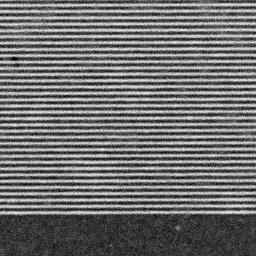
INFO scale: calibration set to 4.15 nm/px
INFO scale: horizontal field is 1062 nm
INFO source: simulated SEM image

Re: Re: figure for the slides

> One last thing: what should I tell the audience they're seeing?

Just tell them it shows parallel lines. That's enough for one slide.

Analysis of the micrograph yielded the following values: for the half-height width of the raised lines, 7.8 nm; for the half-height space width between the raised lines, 4.36 px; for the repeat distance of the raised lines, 26.1 nm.